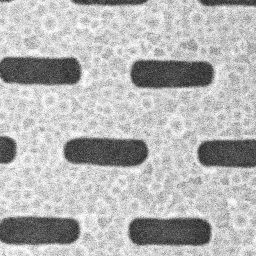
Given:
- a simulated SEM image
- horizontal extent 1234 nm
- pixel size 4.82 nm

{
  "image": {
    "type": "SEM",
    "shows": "holes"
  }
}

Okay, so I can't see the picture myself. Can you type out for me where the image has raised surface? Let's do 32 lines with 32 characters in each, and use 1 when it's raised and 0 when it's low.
11111111110000000011111110000000
11111111111111111111111111111111
11111111111111111111111111111111
11111111111111111111111111111111
11111111111111111111111111111111
11111111111111111111111111111111
11111111111111111111111111111111
00000000001111111000100111111111
00000000001111110000000000011111
00000000001111110000000000011111
10000000001111111000000000111111
11111111111111111111111111111111
11111111111111111111111111111111
11111111111111111111111111111111
11111111111111111111111111111111
11111111111111111111111111111111
11111111111111111111111111111111
00111111100000000011111111000000
00111111000000000011111110000000
00111111000000000011111110000000
01111111100000000011111110000000
11111111111111111111111111111111
11111111111111111111111111111111
11111111111111111111111111111111
11111111111111111111111111111111
11111111111111111111111111111111
11111111111111111111111111111111
00000000001111111000000000111111
00000000001111110000000000111111
00000000001111110000000000011111
10000000011111111000000000111111
11111111111111111111111111111111